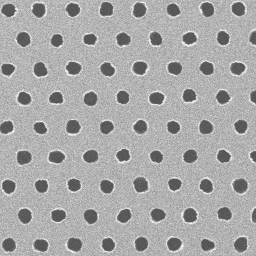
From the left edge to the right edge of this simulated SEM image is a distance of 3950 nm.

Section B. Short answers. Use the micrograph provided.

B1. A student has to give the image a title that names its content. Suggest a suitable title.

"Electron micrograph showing a regular array of holes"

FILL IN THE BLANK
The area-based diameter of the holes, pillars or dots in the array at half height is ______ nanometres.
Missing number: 210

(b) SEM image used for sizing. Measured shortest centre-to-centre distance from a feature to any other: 501 nm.